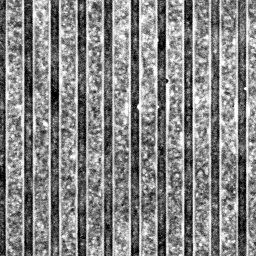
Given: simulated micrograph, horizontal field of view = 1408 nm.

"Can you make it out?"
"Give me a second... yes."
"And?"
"parallel lines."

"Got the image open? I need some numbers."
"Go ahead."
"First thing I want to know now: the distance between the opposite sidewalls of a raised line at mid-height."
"97.7 nanometres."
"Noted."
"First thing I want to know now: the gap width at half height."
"51.6 nm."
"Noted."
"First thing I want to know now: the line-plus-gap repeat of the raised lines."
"147 nm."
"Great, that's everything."